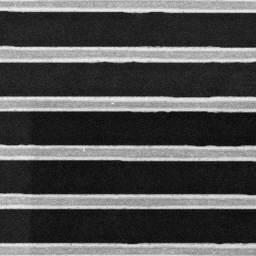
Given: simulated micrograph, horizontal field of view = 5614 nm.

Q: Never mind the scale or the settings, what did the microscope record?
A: lines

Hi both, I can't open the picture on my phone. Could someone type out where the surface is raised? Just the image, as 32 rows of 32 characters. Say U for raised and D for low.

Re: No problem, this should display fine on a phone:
UUUUUUUUUUUUUUUUUUUUUUUUUUUUUUUU
DDDDDDDDDDDDDDDDDDDDDDUUUUUUUUUU
DDDDDDDDDDDDDDDDDDDDDDDDDDDDDDDD
DDDDDDDDDDDDDDDDDDDDDDDDDDDDDDDD
DDDDDDDDDDDDDDDDDDDDDDDDDDDDDDDD
DDDDDDDDDDDDDDDDDDDDDDDDDDDDDDDD
UUUUUUUUUUUUUUUUUUUUUUUUUUUUUUUU
UUUUUUUUUUUUUUUUUUUUUUUUUUUUUUUU
DDDDDDDDDDDDDDDDDDDDDDDDDDDDDDDD
DDDDDDDDDDDDDDDDDDDDDDDDDDDDDDDD
DDDDDDDDDDDDDDDDDDDDDDDDDDDDDDDD
DDDDDDDDDDDDDDDDDDDDDDDDDDDDDDDD
UUUUUUUUUUUUUUUUUUUUUUUUUUUUUUUU
UUUUUUUUUUUUUUUUUUUUUUUUUUUUUUUU
DDDDDDDDDDDDDDDDDDDDDDDDDDDDDDDD
DDDDDDDDDDDDDDDDDDDDDDDDDDDDDDDD
DDDDDDDDDDDDDDDDDDDDDDDDDDDDDDDD
DDDDDDDDDDDDDDDDDDDDDDDDDDDDDDDD
UUUUUUUUUUUUUUUUUUUUUUUUUUUUUUUU
UUUUUUUUUUUUUUUUUUUUUUUUUUUUUUUU
DDDDDDDDDDDDDDDDDDDDDDDDDDDDDDDD
DDDDDDDDDDDDDDDDDDDDDDDDDDDDDDDD
DDDDDDDDDDDDDDDDDDDDDDDDDDDDDDDD
DDDDDDDDDDDDDDDDDDDDDDDDDDDDDDDD
UUUUUUUUUUUUUUUUUUUUUUUUUUUUUUUU
UUUUUUUUUUUUUUUUUUUUUUUUUUUUUUUU
DDDDDDDDDDDDDDDDDDDDDDDDDDDDDDDD
DDDDDDDDDDDDDDDDDDDDDDDDDDDDDDDD
DDDDDDDDDDDDDDDDDDDDDDDDDDDDDDDD
DDDDDDDDDDDDDDDDDDDDDDDDDDDDDDDD
UDUUUUUUUUUUDUDDDDDUUUDDDDDDDDDD
UUUUUUUUUUUUUUUUUUUUUUUUUUUUUUUU